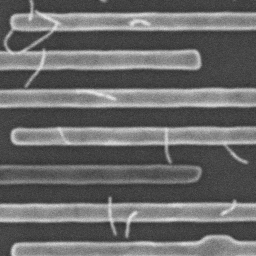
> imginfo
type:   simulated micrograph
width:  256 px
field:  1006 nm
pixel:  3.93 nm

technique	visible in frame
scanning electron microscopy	wiring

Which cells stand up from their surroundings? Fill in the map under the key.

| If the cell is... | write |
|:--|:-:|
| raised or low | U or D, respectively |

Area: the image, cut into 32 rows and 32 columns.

DDDDDDDDDDDDDDDDDDDDDDDDDDDDDDDD
DDDDUDDDDDDDDDDDDDDDDDDDDDDDDDDD
DUUUUUUUUUUUUUUUUUUUUUUUUUUUUUUU
DDUUUUUUUUUUUUUUUUUUUUUUUUUUUUUU
DDDDDDDDDDDDDDDDDDDDDDDDDDDDDDDD
DDDDDDDDDDDDDDDDDDDDDDDDDDDDDDDD
DUUUDUUUUUUUUUUUUUUUUUUUUDDDDDDD
UUUUUUUUUUUUUUUUUUUUUUUUUDDDDDDD
UUUUUUUUUUUUUUUUUUUUUUUUUDDDDDDD
DDDDDDDDDDDDDDDDDDDDDDDDDDDDDDDD
DDDDDDDDDDDDDDDDDDDDDDDDDDDDDDDD
UUUUUUUUUUUUUUUUUUUUUUUUUUUUUUUU
UUUUUUUUUUUUUUUUUUUUUUUUUUUUUUUU
DDDDDDDDDDDDDDDDDDDDDDDDDDDDDDDD
DDDDDDDDDDDDDDDDDDDDDDDDDDDDDDDD
DDDDDDDDDDDDDDDDDDDDDDDDDDDDDDDD
DDUUUUUUUUUUUUUUUUUUUUUUUUUUUUUU
DUUUUUUUUUUUUUUUUUUUUUUUUUUUUUUU
DDDDDDDDDDDDDDDDDDDDDDDDDDDDDDDD
DDDDDDDDDDDDDDDDDDDDDDDDDDDDDDDD
DDDDDDDDDDDDDDDDDDDDDDDDDDDDDDDD
UUUUUUUUUUUUUUUUUUUUUUUUUDDDDDDD
UUUUUUUUUUUUUUUUUUUUUUUUUDDDDDDD
DDDDDDDDDDDDDDDDDDDDDDDDDDDDDDDD
DDDDDDDDDDDDDDDDDDDDDDDDDDDDDDDD
DDDDDDDDDDDDDUDUUUUDDUUUUUUUUUUD
UUUUUUUUUUUUUUUUUUUUUUUUUUUUUUUU
UUUUUUUUUUUUUUUUUUUUUUUUUUUUUUUU
DDDDDDDDDDDDDDDDDDDDDDDDDDDDDDDD
DDDDDDDDDDDDDDDDDDDDDDDDDDDDDDDD
DDUUUUUUUUUUUUUUUUUUUUUUUUUUUUUU
DUUUUUUUUUUUUUUUUUUUUUUUUUUUUUUU